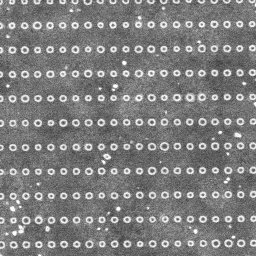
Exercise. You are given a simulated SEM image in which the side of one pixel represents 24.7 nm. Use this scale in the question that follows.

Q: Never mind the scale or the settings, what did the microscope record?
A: a regular array of raised bodies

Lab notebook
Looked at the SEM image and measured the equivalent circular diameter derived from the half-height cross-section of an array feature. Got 145 nm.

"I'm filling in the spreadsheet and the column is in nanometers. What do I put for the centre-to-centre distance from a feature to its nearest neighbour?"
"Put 309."